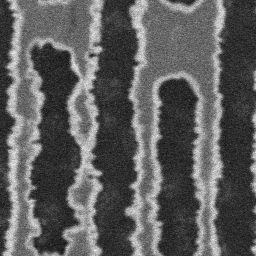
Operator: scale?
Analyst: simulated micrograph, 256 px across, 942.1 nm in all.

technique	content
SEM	one or a few lines or trenches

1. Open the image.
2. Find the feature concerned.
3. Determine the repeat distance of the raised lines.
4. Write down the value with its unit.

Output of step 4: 60.9 px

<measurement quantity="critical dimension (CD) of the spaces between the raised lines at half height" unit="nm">150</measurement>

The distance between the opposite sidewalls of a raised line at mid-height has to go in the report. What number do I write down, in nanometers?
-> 78.1